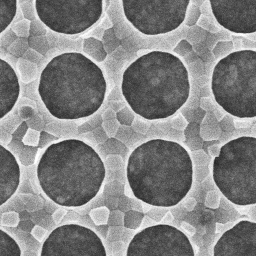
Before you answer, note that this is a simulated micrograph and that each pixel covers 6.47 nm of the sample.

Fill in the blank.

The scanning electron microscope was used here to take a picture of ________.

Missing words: holes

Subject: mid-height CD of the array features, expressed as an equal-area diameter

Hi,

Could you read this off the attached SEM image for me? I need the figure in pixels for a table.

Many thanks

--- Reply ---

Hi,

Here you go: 67.5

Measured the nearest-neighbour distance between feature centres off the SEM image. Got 551 nm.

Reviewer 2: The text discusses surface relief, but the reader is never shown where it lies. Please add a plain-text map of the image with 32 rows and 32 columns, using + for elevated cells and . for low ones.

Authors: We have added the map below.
..++.........++.........++......
..+++........+++.......++++.....
..+++.......++++.......++++.....
.+++++.....++++++.....++++++....
++++++++++++++++++++++++++++++++
++++++++++++++++++++++++++++++++
+++++++++++++++++++..++++++++...
++++++.....++++++......+++++....
..++++......++++.......++++.....
..+++........++.........+++.....
..+++........++.........++......
..+++........++.........+++.....
..+++........+++.......++++.....
..++++......++++.......+++++....
.++++++....+++++++...++++++++...
++++++++++++++++++++++++++++++++
++++++++++++++++++++++++++++++++
++++++++..+++++++++.+++++++++...
.+++++......+++++......+++++....
..+++.......++++........+++.....
..+++........+++........+++.....
..+++........+++........+++.....
..+++........+++........+++.....
..+++........+++........+++.....
.+++++......+++++......+++++....
+++++++....++++++++...+++++++...
++++++++++++++++++++++++++++++++
++++++++++++++++++++++++++++++++
+++++++....+++++++....+++++++...
.+++++......+++++......+++++....
..+++........+++........+++.....
...++........+++........+++.....